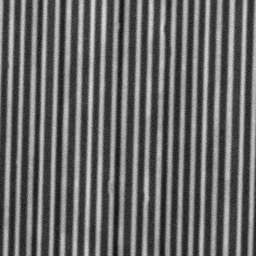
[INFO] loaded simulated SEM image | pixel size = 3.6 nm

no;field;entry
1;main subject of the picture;parallel lines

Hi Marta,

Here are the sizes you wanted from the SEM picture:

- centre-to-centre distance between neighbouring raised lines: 41.9 nm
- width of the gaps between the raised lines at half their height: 0.0275 micrometres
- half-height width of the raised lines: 17.1 nanometers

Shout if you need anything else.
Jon